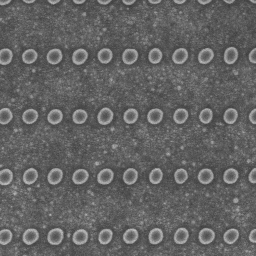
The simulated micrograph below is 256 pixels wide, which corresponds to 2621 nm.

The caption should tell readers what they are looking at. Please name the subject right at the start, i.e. a regular array of raised bodies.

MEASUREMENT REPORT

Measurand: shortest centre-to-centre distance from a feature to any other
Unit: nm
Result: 254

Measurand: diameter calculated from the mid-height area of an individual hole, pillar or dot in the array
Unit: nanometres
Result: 145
